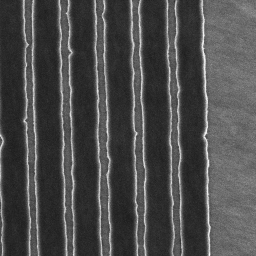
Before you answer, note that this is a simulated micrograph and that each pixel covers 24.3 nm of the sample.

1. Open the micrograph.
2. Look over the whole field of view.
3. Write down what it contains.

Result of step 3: parallel lines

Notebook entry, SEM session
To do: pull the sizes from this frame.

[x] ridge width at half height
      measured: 690 nm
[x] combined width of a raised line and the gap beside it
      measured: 35.9 px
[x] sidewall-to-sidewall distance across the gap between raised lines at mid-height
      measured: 192 nanometers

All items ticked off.